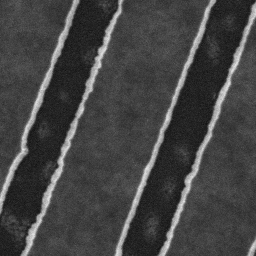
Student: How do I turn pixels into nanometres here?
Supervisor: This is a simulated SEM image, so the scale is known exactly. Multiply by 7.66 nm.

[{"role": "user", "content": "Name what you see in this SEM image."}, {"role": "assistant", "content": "one or a few lines or trenches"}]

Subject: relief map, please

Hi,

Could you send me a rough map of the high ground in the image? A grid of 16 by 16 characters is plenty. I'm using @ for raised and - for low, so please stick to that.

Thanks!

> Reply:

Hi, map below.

@@@@@--@@@@@@---
@@@@---@@@@@@---
@@@@---@@@@@---@
@@@---@@@@@@---@
@@@---@@@@@@--@@
@@@---@@@@@---@@
@@---@@@@@@---@@
@@---@@@@@---@@@
@@--@@@@@@---@@@
@---@@@@@@---@@@
@---@@@@@---@@@@
---@@@@@@---@@@@
---@@@@@@--@@@@@
---@@@@@---@@@@@
--@@@@@@---@@@@@
--@@@@@---@@@@@@